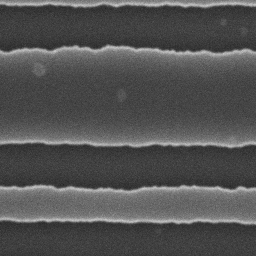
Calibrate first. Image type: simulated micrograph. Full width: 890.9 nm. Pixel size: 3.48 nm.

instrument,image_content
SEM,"lines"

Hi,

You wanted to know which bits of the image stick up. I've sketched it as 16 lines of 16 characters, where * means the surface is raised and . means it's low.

................
................
................
****************
****************
****************
****************
****************
****************
................
................
................
****************
****************
................
................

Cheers